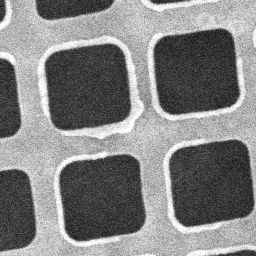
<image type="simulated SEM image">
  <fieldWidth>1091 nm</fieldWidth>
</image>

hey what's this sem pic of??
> holes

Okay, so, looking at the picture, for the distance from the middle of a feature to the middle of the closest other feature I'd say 468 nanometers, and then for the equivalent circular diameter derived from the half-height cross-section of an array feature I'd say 383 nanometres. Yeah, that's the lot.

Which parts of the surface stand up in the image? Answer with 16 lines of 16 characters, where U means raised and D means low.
UUDDDDDUUUUUUUUU
UUUUUUUUUUUUUUUU
UUUUUUUUUUDDDDDU
UUUDDDDDUUDDDDDU
DUUDDDDDUUDDDDDU
DUUDDDDDUUDDDDDU
DUUDDDDDUUDDDDDU
DUUDDDDDUUUUUUUU
DUUUUUUUUUUUUUUU
UUUUUUUUUUUDDDDD
UUUUDDDDDUUDDDDD
DDUUDDDDDUUDDDDD
DDUUDDDDDUUDDDDD
DDUUDDDDDUUDDDDU
DDUUDDDDUUUUUUUU
DUUUUUUUUUUUUUUU